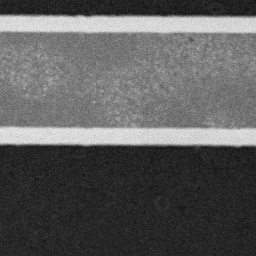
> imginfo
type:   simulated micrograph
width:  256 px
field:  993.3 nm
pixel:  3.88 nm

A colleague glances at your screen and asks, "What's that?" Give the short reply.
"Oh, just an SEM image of one or a few lines or trenches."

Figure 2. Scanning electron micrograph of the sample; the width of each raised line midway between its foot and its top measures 0.436 um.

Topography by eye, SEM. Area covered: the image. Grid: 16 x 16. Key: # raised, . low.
................
##.##...##......
################
################
################
################
################
################
.....###########
................
................
................
................
................
................
................